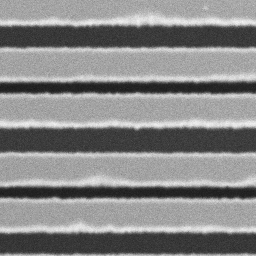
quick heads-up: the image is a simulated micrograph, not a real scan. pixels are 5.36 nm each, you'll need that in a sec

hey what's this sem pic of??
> lines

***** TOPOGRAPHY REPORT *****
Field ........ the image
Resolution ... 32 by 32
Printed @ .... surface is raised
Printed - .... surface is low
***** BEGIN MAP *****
@@@@@@@@@@@@@@@@@@@@@@@@@@@@@@@@
@@@@@@@@@@@@@@@@@@@@@@@@@@@@@@@@
@@@@@@@@@@@@@@@@@@@@@@@@@@@@@@@@
--------------------------------
--------------------------------
--------------------------------
@@@@@@@@@@@@@@@@@@@@@@@@@@@@@@@@
@@@@@@@@@@@@@@@@@@@@@@@@@@@@@@@@
@@@@@@@@@@@@@@@@@@@@@@@@@@@@@@@@
@@@@@@@@@@@@@@@@@@@@@@@@@@@@@@@@
--------------------------------
--------------------------------
@@@@@@@@@@@@@@@@@@@@@@@@@@@@@@@@
@@@@@@@@@@@@@@@@@@@@@@@@@@@@@@@@
@@@@@@@@@@@@@@@@@@@@@@@@@@@@@@@@
@@@@@@@@@@@@@@@@@@@@@@@@@@@@@@@@
--------------------------------
--------------------------------
--------------------------------
@@@@@@@@@@@@@@@@@@@@@@@@@@@@@@@@
@@@@@@@@@@@@@@@@@@@@@@@@@@@@@@@@
@@@@@@@@@@@@@@@@@@@@@@@@@@@@@@@@
@@@@@@@@@@@@@@@@@@@@@@@@@@@@@@@@
--------------------------------
--------------------------------
@@@@@@@@@@@@@@@@@@@@@@@@@@@@@@@@
@@@@@@@@@@@@@@@@@@@@@@@@@@@@@@@@
@@@@@@@@@@@@@@@@@@@@@@@@@@@@@@@@
@@@@@@@@@@@@@@@@@@@@@@@@@@@@@@@@
--------------------------------
--------------------------------
--------------------------------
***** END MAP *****